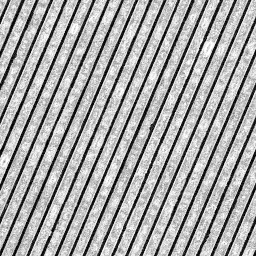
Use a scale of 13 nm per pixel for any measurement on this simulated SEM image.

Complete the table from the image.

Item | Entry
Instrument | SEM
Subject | parallel lines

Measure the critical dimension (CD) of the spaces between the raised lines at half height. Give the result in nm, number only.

49.3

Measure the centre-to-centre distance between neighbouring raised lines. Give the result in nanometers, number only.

169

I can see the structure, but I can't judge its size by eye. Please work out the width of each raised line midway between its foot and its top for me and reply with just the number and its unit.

0.116 micrometres